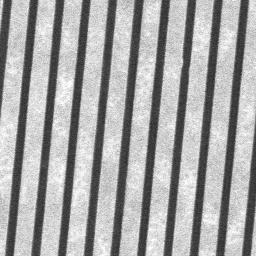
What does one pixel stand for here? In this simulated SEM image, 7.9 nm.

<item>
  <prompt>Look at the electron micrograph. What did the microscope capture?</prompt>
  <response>parallel lines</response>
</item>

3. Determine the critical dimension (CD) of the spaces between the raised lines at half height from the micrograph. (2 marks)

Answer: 65.8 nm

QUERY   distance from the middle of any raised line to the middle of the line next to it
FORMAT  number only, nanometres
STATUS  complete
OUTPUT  207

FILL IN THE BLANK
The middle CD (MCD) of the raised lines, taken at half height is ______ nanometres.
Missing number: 146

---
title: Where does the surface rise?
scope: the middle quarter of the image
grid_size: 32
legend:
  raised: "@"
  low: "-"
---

@@@--@@@@---@@@@--@@@@@--@@@@@--
@@@--@@@@---@@@@--@@@@@--@@@@--@
@@@--@@@@---@@@@--@@@@@--@@@@--@
@@@--@@@@--@@@@@--@@@@---@@@@--@
@@@--@@@@--@@@@@--@@@@---@@@@--@
@@---@@@@--@@@@@--@@@@---@@@@--@
@@--@@@@@--@@@@@--@@@@--@@@@@--@
@@--@@@@@--@@@@@--@@@@--@@@@@--@
@@--@@@@@--@@@@---@@@@--@@@@@--@
@@--@@@@@--@@@@--@@@@@--@@@@---@
@@--@@@@@--@@@@--@@@@@--@@@@---@
@@--@@@@--@@@@@--@@@@@--@@@@---@
@@--@@@@--@@@@@--@@@@@--@@@@--@@
@@--@@@@--@@@@@--@@@@@--@@@@--@@
@@--@@@@--@@@@@--@@@@---@@@@--@@
@@--@@@@--@@@@@--@@@@--@@@@@--@@
@--@@@@@--@@@@@--@@@@---@@@@--@@
@--@@@@@--@@@@---@@@@--@@@@@--@@
@--@@@@@--@@@@---@@@@--@@@@@--@@
@--@@@@@--@@@@--@@@@@--@@@@---@@
@--@@@@@--@@@@--@@@@@--@@@@--@@@
@--@@@@---@@@@--@@@@@--@@@@--@@@
@--@@@@---@@@@--@@@@@--@@@@--@@@
@--@@@@---@@@@--@@@@@--@@@@--@@@
@--@@@@--@@@@@--@@@@--@@@@@--@@@
@--@@@@--@@@@@--@@@@--@@@@@--@@@
---@@@@--@@@@@--@@@@--@@@@@--@@@
--@@@@@--@@@@---@@@@--@@@@@--@@@
--@@@@@--@@@@---@@@@--@@@@@--@@@
--@@@@@--@@@@--@@@@@--@@@@---@@@
--@@@@@--@@@@--@@@@@--@@@@---@@@
--@@@@@--@@@@--@@@@@--@@@@---@@@